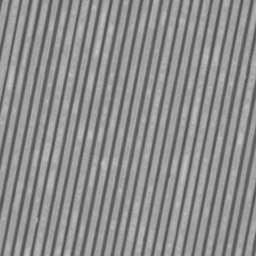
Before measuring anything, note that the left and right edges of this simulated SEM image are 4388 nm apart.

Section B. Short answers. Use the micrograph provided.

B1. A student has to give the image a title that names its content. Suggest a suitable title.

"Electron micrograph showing parallel lines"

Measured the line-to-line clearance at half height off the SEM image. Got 3.81 px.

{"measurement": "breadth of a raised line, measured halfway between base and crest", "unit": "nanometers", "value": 101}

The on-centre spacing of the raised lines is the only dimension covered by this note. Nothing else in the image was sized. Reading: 169 nanometers